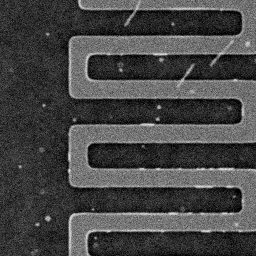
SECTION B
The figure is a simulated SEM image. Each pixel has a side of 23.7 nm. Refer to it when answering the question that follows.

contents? groups of lines, slits or small figures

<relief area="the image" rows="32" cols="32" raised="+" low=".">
..........++++++++++++++++++++++
..............................++
..............................++
..............................++
.............................+++
.........+++++++++++++++++++++++
.........+++++++++++++++++++++++
.........++.....................
.........++.....................
.........++.....................
.........+++++++++++++++++++++++
.........+++++++++++++++++++++++
..............................++
..............................++
..............................++
..............................++
.........+++++++++++++++++++++++
.........+++++++++++++++++++++++
.........++.....................
.........++.....................
.........++.....................
.........+++++++++++++++++++++++
.........+++++++++++++++++++++++
..............................++
..............................++
..............................++
..............................++
.........+++++++++++++++++++++++
.........+++++++++++++++++++++++
.........++.....................
.........++.....................
.........++.....................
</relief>